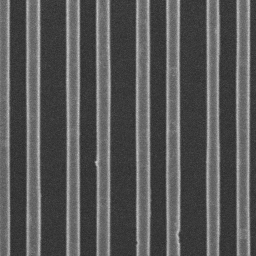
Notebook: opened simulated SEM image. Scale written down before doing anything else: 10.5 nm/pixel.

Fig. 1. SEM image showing parallel lines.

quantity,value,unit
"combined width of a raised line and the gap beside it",0.368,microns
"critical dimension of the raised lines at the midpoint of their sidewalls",0.13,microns